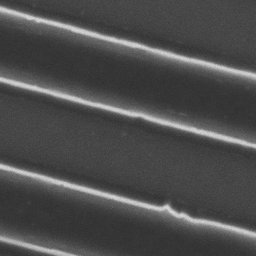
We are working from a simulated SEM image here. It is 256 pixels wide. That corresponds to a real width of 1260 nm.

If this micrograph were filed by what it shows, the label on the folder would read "one or a few lines or trenches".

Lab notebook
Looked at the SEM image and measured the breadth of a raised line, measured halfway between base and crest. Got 338 nanometres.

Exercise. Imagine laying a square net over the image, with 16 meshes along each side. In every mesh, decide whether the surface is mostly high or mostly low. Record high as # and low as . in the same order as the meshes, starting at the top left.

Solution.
................
####............
#######.........
###########.....
###############.
..##############
......##########
..........######
.............###
................
................
####............
########........
###########.....
###############.
..##############